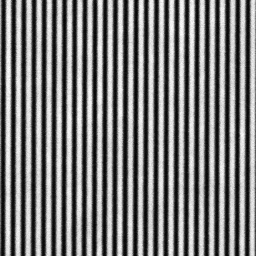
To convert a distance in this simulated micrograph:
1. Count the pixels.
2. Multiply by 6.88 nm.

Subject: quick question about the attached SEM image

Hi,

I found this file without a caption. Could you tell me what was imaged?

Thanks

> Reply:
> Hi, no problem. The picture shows parallel lines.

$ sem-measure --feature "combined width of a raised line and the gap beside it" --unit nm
70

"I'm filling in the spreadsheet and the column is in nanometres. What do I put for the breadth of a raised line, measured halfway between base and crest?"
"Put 36.1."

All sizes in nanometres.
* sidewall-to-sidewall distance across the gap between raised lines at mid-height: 36.1